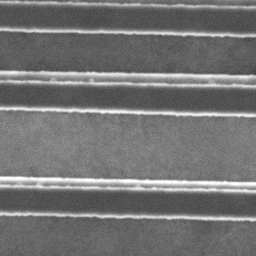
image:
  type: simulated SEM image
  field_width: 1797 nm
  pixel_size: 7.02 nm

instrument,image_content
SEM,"lines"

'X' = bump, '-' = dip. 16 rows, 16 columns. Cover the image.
XXXXXXXXXXXXXXXX
XXXXXXXXXXXXXXXX
----------------
----------------
----------------
XXXXXXXXXXXXXXXX
XXXXXXXXXXXXXXXX
----------------
----------------
----------------
----------------
XXXXXXXXXXXXXXXX
XXXXXXXXXXXXXXXX
------XXXXXXXXXX
----------------
----------------